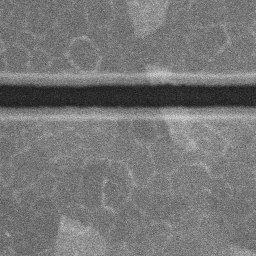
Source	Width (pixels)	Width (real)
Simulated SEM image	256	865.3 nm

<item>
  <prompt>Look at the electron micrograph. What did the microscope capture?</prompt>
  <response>one or a few lines or trenches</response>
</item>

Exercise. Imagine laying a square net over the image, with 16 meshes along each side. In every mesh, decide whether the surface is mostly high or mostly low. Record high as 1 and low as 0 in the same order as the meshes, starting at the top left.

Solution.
1111111111111111
1111111111111111
1111111111111111
1111111111111111
1111111111111111
0000000000000000
0000000000000000
1111111111111111
1111111111111111
1111111111111111
1111111111111111
1111111111111111
1111111111111111
1111111111111111
1111111111111111
1111111111111111